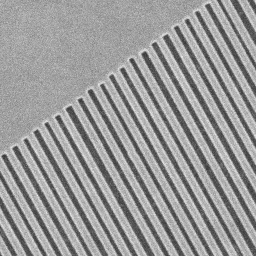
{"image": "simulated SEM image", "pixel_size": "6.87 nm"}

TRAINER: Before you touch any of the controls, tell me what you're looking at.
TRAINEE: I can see parallel lines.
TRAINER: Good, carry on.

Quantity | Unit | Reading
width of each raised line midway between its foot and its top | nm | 47.2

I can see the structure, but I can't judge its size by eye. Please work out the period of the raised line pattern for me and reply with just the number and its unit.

90.8 nm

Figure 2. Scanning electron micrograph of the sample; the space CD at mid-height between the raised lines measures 42 nanometers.